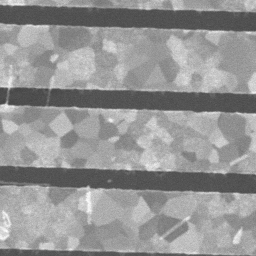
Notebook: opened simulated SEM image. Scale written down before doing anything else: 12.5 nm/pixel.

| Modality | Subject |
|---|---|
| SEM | lines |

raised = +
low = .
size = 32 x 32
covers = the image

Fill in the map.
++++++++++++++++++++++++++++++++
...............................+
................................
+++++++++++++++.+...............
++++++++++++++++++++++++++++++++
++++++++++++++++++++++++++++++++
++++++++++++++++++++++++++++++++
++++++++++++++++++++++++++++++++
++++++++++++++++++++++++++++++++
++++++++++++++++++++++++++++++++
++++++++++++++++++++++++++++++++
.......................+++++++++
................................
++++++++++......................
++++++++++++++++++++++++++++++++
++++++++++++++++++++++++++++++++
++++++++++++++++++++++++++++++++
++++++++++++++++++++++++++++++++
++++++++++++++++++++++++++++++++
++++++++++++++++++++++++++++++++
++++++++++++++++++++++++++++++++
.........................+++++++
................................
+++++++++++.....................
++++++++++++++++++++++++++++++++
++++++++++++++++++++++++++++++++
++++++++++++++++++++++++++++++++
++++++++++++++++++++++++++++++++
++++++++++++++++++++++++++++++++
++++++++++++++++++++++++++++++++
++++++++++++++++++++++++++++++++
..................++++++++++++++